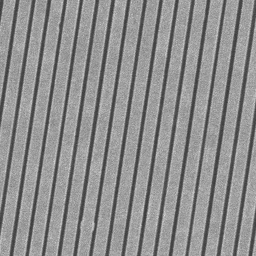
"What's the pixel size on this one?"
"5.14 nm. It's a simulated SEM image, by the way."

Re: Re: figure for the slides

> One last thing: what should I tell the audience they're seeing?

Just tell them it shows parallel lines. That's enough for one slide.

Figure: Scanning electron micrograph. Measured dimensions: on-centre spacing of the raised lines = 81.1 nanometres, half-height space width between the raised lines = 22.2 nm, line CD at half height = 0.0591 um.